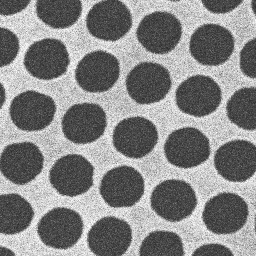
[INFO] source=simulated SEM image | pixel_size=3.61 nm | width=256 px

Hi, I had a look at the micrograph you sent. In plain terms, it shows a regular array of holes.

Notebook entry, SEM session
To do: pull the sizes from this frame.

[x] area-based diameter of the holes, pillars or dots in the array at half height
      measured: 159 nanometres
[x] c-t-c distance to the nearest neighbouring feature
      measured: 189 nanometres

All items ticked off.